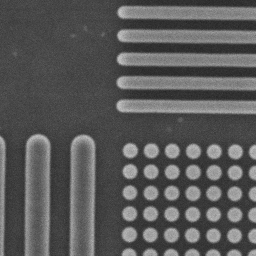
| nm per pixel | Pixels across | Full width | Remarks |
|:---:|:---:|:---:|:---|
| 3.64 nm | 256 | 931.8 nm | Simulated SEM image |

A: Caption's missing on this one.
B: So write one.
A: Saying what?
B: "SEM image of groups of lines, slits or small figures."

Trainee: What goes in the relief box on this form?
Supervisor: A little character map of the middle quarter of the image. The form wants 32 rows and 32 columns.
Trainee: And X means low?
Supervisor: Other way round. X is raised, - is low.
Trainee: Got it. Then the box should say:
--------------------------------
--------------------------------
--------------------------------
--------------XXXXXXXXXXXXXXXXXX
-------------XXXXXXXXXXXXXXXXXXX
--------------XXXXXXXXXXXXXXXXXX
--------------------------------
--------------------------------
--------------------------------
-------------XXXXXXXXXXXXXXXXXXX
-------------XXXXXXXXXXXXXXXXXXX
--------------XXXXXXXXXXXXXXXXXX
--------------------------------
--------------------------------
--------------------------------
--------------------------------
--------------------------------
--------------------------------
---XXXX-------------------------
--XXXXX-------------------------
--XXXXXX-------XXX--XXX---XX---X
--XXXXXX-------XXX--XXX--XXXX--X
--XXXXXX-------XXX--XXX--XXXX--X
--XXXXXX------------------------
--XXXXXX------------------------
--XXXXXX-------XXX---XX---XX---X
--XXXXXX-------XXX--XXX--XXXX--X
--XXXXX--------XXX--XXX--XXXX--X
--XXXXX--------------X----XX---X
--XXXXX-------------------------
--XXXXX---------X---------------
--XXXXX--------XXX--XXX--XXX---X